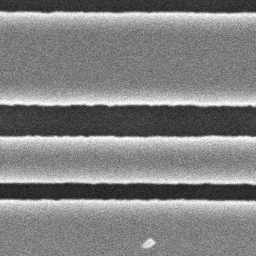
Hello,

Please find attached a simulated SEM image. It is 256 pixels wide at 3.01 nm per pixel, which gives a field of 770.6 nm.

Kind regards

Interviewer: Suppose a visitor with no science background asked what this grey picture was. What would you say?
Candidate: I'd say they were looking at lines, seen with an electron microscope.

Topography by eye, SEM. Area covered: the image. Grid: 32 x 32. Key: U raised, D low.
DDDDDDDDDDDDDDDDDDDDDDDDDDDDDDDD
UDDUDDDUDDDDDDDDDDDDDDDDDDDDDDDD
UUUUUUUUUUUUUUUUUUUUUUUUUUUUUUUU
UUUUUUUUUUUUUUUUUUUUUUUUUUUUUUUU
UUUUUUUUUUUUUUUUUUUUUUUUUUUUUUUU
UUUUUUUUUUUUUUUUUUUUUUUUUUUUUUUU
UUUUUUUUUUUUUUUUUUUUUUUUUUUUUUUU
UUUUUUUUUUUUUUUUUUUUUUUUUUUUUUUU
UUUUUUUUUUUUUUUUUUUUUUUUUUUUUUUU
UUUUUUUUUUUUUUUUUUUUUUUUUUUUUUUU
UUUUUUUUUUUUUUUUUUUUUUUUUUUUUUUU
UUUUUUUUUUUUUUUUUUUUUUUUUUUUUUUU
UUUUUUUUUUUUUUUUUUUUUUUUUUUUUUUU
DDDDDDDDDDDDDDDDDDDDDDDDDDDDDDDD
DDDDDDDDDDDDDDDDDDDDDDDDDDDDDDDD
DDDDDDDDDDDDDDDDDDDDDDDDDDDDDDDD
DDDDDDDDDDDDDDDDDDDDDDDDDDDDDDDD
UUUUUUUUUUUUUUUUUUUUUUUUUUUUUUUU
UUUUUUUUUUUUUUUUUUUUUUUUUUUUUUUU
UUUUUUUUUUUUUUUUUUUUUUUUUUUUUUUU
UUUUUUUUUUUUUUUUUUUUUUUUUUUUUUUU
UUUUUUUUUUUUUUUUUUUUUUUUUUUUUUUU
UUUUUUUUUUUUUUUUUUUUUUUUUUUUUUUU
DDDDDDDDDDDDDDDDDDDDDDDDDDDDDDDD
DDDDDDDDDDDDDDDDDDDDDDDDDDDDDDDD
UUUUUUUUUUUUUUUUUUUUUUUUUUUUUUUU
UUUUUUUUUUUUUUUUUUUUUUUUUUUUUUUU
UUUUUUUUUUUUUUUUUUUUUUUUUUUUUUUU
UUUUUUUUUUUUUUUUUUUUUUUUUUUUUUUU
UUUUUUUUUUUUUUUUUUUUUUUUUUUUUUUU
UUUUUUUUUUUUUUUUUUUUUUUUUUUUUUUU
UUUUUUUUUUUUUUUUUUUUUUUUUUUUUUUU